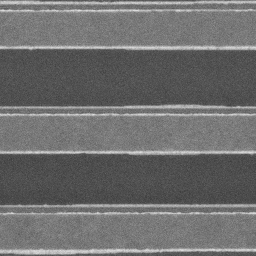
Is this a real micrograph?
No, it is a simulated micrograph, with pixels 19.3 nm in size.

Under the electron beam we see lines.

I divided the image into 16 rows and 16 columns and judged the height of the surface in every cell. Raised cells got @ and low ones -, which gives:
@@@@@@@@@@@@@@@@
@@@@@@@@@@@@@@@@
@@@@@@@@@@@@@@@@
----------------
----------------
----------------
----------------
@@@@@@@@@@@@@@@@
@@@@@@@@@@@@@@@@
@@@@@@@@@@@@@@@@
----------------
----------------
----------------
@@@@@@@@@@@@@@@@
@@@@@@@@@@@@@@@@
@@@@@@@@@@@@@@@@